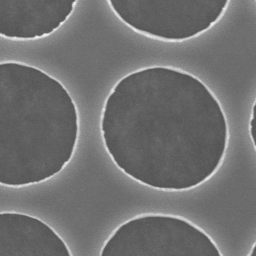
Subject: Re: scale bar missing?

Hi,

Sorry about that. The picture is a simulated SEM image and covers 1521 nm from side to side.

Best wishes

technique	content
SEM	holes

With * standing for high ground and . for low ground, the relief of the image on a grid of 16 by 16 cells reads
....***.......**
....****.....***
****************
****************
...******..*****
....***......***
.....**.......**
.....*........**
.....**.......**
.....**.......**
....****.....***
.********...****
****************
..*******.******
...****......***
....***......***